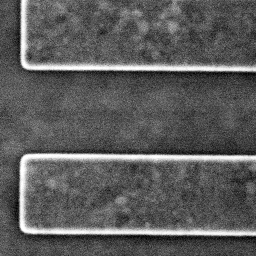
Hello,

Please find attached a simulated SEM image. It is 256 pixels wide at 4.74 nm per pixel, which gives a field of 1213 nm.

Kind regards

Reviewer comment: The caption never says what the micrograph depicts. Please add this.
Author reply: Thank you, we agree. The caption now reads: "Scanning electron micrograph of wiring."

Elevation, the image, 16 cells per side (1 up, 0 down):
0111111111111111
0111111111111111
0111111111111111
0111111111111111
0000000000000000
0000000000000000
0000000000000000
0000000000000000
0000000000000000
0000000000000000
0111111111111111
0111111111111111
0111111111111111
0111111111111111
0011111111111111
0000000000000000